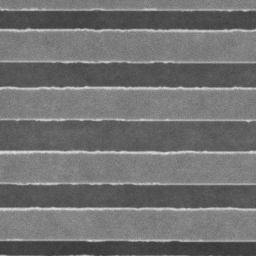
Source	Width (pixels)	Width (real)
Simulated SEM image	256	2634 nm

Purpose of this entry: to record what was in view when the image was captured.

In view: lines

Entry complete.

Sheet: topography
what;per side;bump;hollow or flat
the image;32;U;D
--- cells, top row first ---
UUUUUUUUUUUUUUUUUUUUUUUUUUUUUUUU
DDDDDDDDDDDDDDDDDDDDDDDDDDDDDDDD
DDDDDDDDDDDDDDDDDDDDDDDDDDDDDDDD
DDDDDDDDDDDDDDDDDDDDDDDDDDDDDDDD
UUUUUUUUUUUUUUUUUUUUUUUUUUUUUUUU
UUUUUUUUUUUUUUUUUUUUUUUUUUUUUUUU
UUUUUUUUUUUUUUUUUUUUUUUUUUUUUUUU
UUUUUUUUUUUUUUUUUUUUUUUUUUUUUUUU
DDDDDDDDDDDDDDDDDDDDDDDDDDDDDDDD
DDDDDDDDDDDDDDDDDDDDDDDDDDDDDDDD
DDDDDDDDDDDDDDDDDDDDDDDDDDDDDDDD
UUUUUUUUUUUUUUUUUUUUUUUUUUUUUUUU
UUUUUUUUUUUUUUUUUUUUUUUUUUUUUUUU
UUUUUUUUUUUUUUUUUUUUUUUUUUUUUUUU
UUUUUUUUUUUUUUUUUUUUUUUUUUUUUUUU
DDDDDDDDDDDDDDDDDDDDDDDDDDDDDDDD
DDDDDDDDDDDDDDDDDDDDDDDDDDDDDDDD
DDDDDDDDDDDDDDDDDDDDDDDDDDDDDDDD
DDDDDDDDDDDDDDDDDDDDDDDDDDDDDDDD
UUUUUUUUUUUUUUUUUUUUUUUUUUUUUUUU
UUUUUUUUUUUUUUUUUUUUUUUUUUUUUUUU
UUUUUUUUUUUUUUUUUUUUUUUUUUUUUUUU
UUUUUUUUUUUUUUUUUUUUUUUUUUUUUUUU
DDDDDDDDDDDDDDDDDDDDDDDDDDDDDDDD
DDDDDDDDDDDDDDDDDDDDDDDDDDDDDDDD
DDDDDDDDDDDDDDDDDDDDDDDDDDDDDDDD
UUUUUUUUUUUUUUUUUUUUUUUUUUUUUUUU
UUUUUUUUUUUUUUUUUUUUUUUUUUUUUUUU
UUUUUUUUUUUUUUUUUUUUUUUUUUUUUUUU
UUUUUUUUUUUUUUUUUUUUUUUUUUUUUUUU
DDDDDDDDDDDDDDDDDDDDDDDDDDDDDDDD
DDDDDDDDDDDDDDDDDDDDDDDDDDDDDDDD